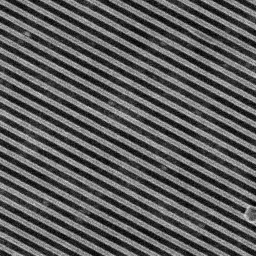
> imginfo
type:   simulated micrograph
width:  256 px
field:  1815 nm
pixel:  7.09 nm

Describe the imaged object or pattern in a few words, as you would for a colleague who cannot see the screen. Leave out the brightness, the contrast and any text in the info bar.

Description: parallel lines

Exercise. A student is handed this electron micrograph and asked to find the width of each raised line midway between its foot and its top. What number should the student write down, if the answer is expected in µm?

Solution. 0.0313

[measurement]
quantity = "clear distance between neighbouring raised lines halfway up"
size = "0.0461 micrometres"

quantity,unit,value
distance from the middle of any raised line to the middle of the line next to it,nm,76.7